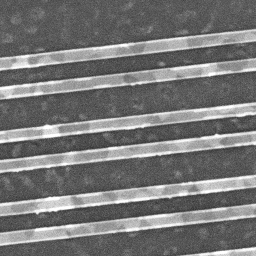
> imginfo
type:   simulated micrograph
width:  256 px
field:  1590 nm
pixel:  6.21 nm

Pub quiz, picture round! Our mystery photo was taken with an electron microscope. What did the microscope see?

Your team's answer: parallel lines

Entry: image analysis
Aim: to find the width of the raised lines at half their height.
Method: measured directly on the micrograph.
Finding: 71.8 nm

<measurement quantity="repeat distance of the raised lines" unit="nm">216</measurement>